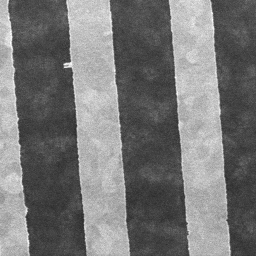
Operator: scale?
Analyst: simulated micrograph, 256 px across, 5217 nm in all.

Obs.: one or a few lines or trenches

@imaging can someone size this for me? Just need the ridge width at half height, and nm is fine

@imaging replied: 858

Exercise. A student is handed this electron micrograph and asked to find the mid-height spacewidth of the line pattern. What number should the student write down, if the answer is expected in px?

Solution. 59.2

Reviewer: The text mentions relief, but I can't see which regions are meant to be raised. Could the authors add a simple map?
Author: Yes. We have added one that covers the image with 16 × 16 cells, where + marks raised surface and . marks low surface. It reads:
+...+++....++...
+...+++....++...
+...+++....++...
+...+++....++...
+...+++....+++..
+....++....+++..
+....++....+++..
+....++....+++..
+....+++...+++..
+....+++...+++..
+....+++...+++..
+....+++...+++..
++...+++....++..
++...+++....++..
++...+++....++..
++...+++....++..